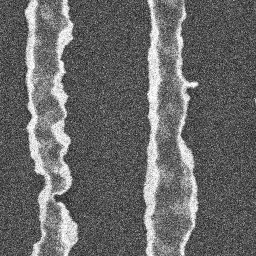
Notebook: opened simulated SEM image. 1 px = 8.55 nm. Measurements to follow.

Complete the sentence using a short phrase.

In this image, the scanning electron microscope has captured one or a few lines or trenches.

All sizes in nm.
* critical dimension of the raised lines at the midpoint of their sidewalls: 267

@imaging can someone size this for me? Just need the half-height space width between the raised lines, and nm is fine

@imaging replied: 748